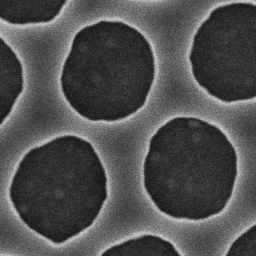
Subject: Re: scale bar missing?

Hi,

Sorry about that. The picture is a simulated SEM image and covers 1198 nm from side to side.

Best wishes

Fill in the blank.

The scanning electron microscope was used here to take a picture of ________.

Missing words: holes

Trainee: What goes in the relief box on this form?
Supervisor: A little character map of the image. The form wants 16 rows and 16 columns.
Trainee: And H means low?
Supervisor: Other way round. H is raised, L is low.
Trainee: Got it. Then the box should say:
LLLLHHHHHHHHHHLL
HLHHHHLLHHHHHLLL
HHHHHLLLLHHHLLLL
LHHHLLLLLLHHLLLL
LHHHLLLLLLHHLLLL
LHHHLLLLLHHHHLLL
LHHHLLLLLHHHHHHH
HHHHHHLHHHHLLHHH
HHHHLHHHHHLLLLHH
HHLLLLHHHLLLLLLH
HLLLLLHHHLLLLLLH
HLLLLLLHHLLLLLLH
HLLLLLLHHHLLLLHH
HLLLLLHHHHHLLHHH
HHLLLHHHHHHHHHHL
HHHHHHHLLLLHHHLL